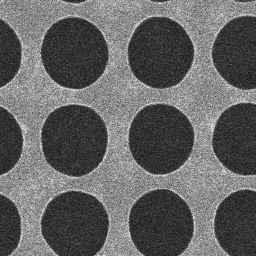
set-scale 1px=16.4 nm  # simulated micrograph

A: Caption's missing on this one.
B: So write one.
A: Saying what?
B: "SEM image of holes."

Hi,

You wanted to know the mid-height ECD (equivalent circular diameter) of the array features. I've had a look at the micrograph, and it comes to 1.14 µm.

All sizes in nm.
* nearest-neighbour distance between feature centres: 1410